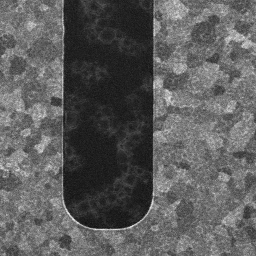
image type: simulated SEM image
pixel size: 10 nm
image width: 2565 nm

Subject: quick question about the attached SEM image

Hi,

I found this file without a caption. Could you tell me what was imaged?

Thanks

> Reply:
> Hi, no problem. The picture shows one or a few lines or trenches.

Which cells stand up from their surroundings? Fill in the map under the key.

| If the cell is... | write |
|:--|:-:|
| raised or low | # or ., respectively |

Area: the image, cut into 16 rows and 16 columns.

####......######
####......######
####......######
####......######
####......######
####......######
####......######
####......######
####......######
####......######
####......######
####......######
####......######
####.....#######
################
################